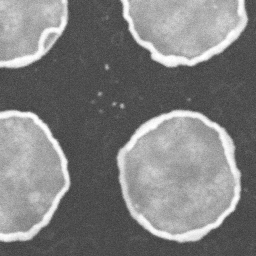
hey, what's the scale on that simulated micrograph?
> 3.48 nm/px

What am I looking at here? raised bodies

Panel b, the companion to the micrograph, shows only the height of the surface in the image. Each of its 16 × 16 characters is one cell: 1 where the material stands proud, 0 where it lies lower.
1111000011111110
1111000011111110
1110000001111100
1100000000111000
0000000000000000
0000000000000000
0000000000000000
1100000001111000
1110000011111100
1111000011111100
1111000011111110
1111000011111110
1111000011111110
1110000011111100
1100000001111000
0000000000000000